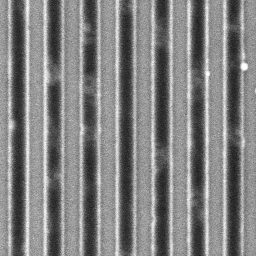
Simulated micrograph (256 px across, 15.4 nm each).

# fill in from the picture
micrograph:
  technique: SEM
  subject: parallel lines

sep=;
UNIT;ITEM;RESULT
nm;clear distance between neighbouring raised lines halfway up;252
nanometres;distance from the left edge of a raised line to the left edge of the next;552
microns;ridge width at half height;0.294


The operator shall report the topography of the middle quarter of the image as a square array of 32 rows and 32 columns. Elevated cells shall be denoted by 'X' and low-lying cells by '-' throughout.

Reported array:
----XXXXX----XXXXX----XXXXX----X
----XXXXX----XXXXX----XXXXX----X
----XXXXX----XXXXX----XXXXX----X
----XXXXX----XXXXX----XXXXX----X
----XXXXX----XXXXX----XXXXX----X
----XXXXX----XXXXX----XXXXX----X
----XXXXX----XXXXX----XXXXX----X
----XXXXX----XXXXX----XXXXX----X
----XXXXX----XXXXX----XXXXX----X
----XXXXX----XXXXX----XXXXX----X
----XXXXX----XXXXX----XXXXX----X
----XXXXX----XXXXX----XXXXX----X
----XXXXX----XXXXX----XXXXX----X
----XXXXX----XXXXX----XXXXX----X
----XXXXX----XXXXX----XXXXX----X
----XXXXX----XXXXX----XXXXX----X
----XXXXX----XXXXX----XXXXX----X
----XXXXX----XXXXX----XXXXX----X
----XXXXX----XXXXX----XXXXX----X
----XXXXX----XXXXX----XXXXX----X
----XXXXX----XXXXX----XXXXX----X
----XXXXX----XXXXX----XXXXX----X
----XXXXX----XXXXX----XXXXX----X
----XXXXX----XXXXX----XXXXX----X
----XXXXX----XXXXX----XXXXX----X
----XXXXX----XXXXX----XXXXX----X
----XXXXX----XXXXX----XXXXX----X
----XXXXX----XXXXX----XXXXX----X
----XXXXX----XXXXX----XXXXX----X
----XXXXX----XXXXX----XXXXX----X
----XXXXX----XXXXX----XXXXX----X
----XXXXX----XXXXX----XXXXX----X